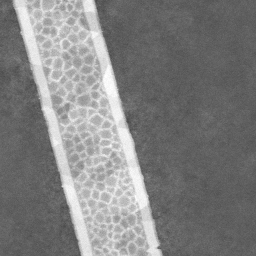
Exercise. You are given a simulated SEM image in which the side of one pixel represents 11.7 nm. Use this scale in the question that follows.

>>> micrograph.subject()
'one or a few lines or trenches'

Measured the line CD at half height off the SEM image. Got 758 nanometers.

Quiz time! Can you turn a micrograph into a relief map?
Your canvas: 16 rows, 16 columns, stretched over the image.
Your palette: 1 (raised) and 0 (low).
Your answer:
0111110000000000
0011110000000000
0011110000000000
0011110000000000
0011111000000000
0001111000000000
0001111000000000
0001111000000000
0000111100000000
0000111100000000
0000111100000000
0000111110000000
0000011110000000
0000011110000000
0000011110000000
0000011111000000